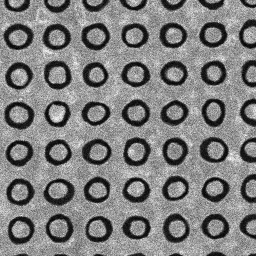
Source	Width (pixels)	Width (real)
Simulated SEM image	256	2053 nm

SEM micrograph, a regular array of ring-shaped grooves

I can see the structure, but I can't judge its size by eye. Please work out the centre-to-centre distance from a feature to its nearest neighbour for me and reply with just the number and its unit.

300 nm